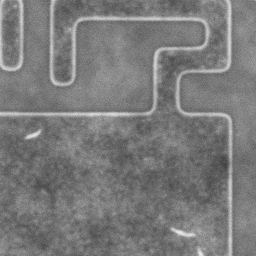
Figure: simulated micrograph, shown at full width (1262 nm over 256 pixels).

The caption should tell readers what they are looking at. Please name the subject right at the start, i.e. wiring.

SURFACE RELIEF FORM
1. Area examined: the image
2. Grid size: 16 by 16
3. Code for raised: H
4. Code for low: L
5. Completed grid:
HLLHHHHHHHHHHHLL
HLLHHLLLLLLLLHLL
HLLHHLLLLLLLLHLL
HLLHHLLLLLHHHHLL
LLLHHLLLLLHHLLLL
LLLLLLLLLLHLLLLL
LLLLLLLLLLHLLLLL
HHHHHHHHHHHHHHLL
HHHHHHHHHHHHHHLL
HHHHHHHHHHHHHHLL
HHHHHHHHHHHHHHLL
HHHHHHHHHHHHHHLL
HHHHHHHHHHHHHHLL
HHHHHHHHHHHHHHLL
HHHHHHHHHHHHHHLL
HHHHHHHHHHHHHHLL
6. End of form